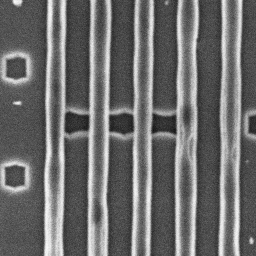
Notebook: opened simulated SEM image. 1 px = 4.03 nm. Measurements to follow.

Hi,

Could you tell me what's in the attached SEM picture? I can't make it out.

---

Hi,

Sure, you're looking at wiring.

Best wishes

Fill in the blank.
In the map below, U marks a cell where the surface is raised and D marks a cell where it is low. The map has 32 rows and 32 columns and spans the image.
DDDDDDUUDDDDUUDDDUUDDDUUUDDDUUDD
DDDDDDUUDDDDUUDDDUUDDDUUUDDDUUDD
DDDDDDUUDDDDUUDDDUUDDDUUUDDDUUDD
DDDDDDUUDDDUUUDDDUUDDDUUUDDDUUDD
DDDDDDUUDDDUUUDDDUUDDDUUUDDDUUDD
DDDDDDUUDDDUUUDDDUUDDDUUDDDDUUDD
DDDDDDUUDDDUUUDDDUUDDDUUDDDDUUDD
DDDDDDUUDDDUUUDDDUUDDDUUDDDDUUDD
DDDDDDUUDDDUUUDDDUUDDDUUDDDDUUDD
DDDDDDUUDDDUUDDDDUUDDDUUUDDDUUDD
DDDDDDUUDDDUUDDDDUUDDDUUUDDDUUDD
DDDDDDUUDDDUUDDDDUUDDDUUDDDDUUDD
DDDDDDUUDDDUUDDDDUUDDDUUDDDDUUDD
DDDDDDUUDDDUUDDDDUUDDDUUUDDDUUDD
DDDDDDUUDDDUUDDDDUUDDDUUUDDDUUDD
DDDDDDUUDDDUUDDDDUUDDDUUUDDDUUDD
DDDDDDUUDDDUUDDDDUUDDDUUDDDDUUDD
DDDDDDUUDDDUUDDDDUUDDDUUDDDDUUDD
DDDDDDUUDDDUUDDDDUUDDDUUDDDDUUDD
DDDDDDUUDDDUUDDDDUUDDDUUDDDDUUDD
DDDDDDUUDDDUUDDDDUUDDDUUDDDDUUDD
DDDDDDUUDDDUUDDDDUUDDDUUDDDDUUDD
DDDDDDUUDDDUUDDDDUUDDDUUDDDDUUDD
DDDDDDUUDDDUUDDDDUUDDDUUDDDDUUDD
DDDDDDUUDDDUUDDDDUUDDDUUDDDDUUDD
DDDDDDUUDDDUUDDDDUUDDDUUDDDDUUDD
DDDDDDUUDDDUUDDDDUUDDDUUDDDDUUDD
DDDDDDUUDDDUUDDDDUUDDDUUDDDDUUDD
DDDDDDUUDDDUUDDDDUUDDDUUDDDDUUDD
DDDDDDUUDDDUUDDDDUUDDDUUDDDDUUDD
DDDDDDUUDDDUUDDDDUUDDDUUDDDDUUDD
DDDDDDUUDDDUUDDDDUUDDDUUDDDDUUDD